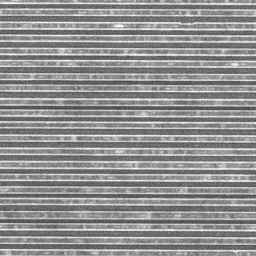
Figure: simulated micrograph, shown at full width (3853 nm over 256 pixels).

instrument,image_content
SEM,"parallel lines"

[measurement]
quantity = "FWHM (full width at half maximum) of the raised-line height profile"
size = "0.0997 microns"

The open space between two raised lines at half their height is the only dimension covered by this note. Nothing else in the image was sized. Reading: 99.7 nanometers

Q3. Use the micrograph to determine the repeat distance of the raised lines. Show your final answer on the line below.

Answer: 0.191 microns